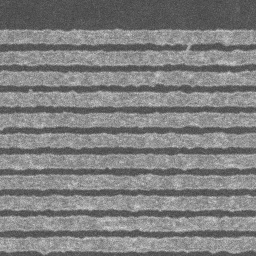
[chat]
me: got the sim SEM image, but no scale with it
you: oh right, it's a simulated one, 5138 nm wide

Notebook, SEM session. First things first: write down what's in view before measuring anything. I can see parallel lines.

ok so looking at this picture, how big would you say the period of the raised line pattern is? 416 nm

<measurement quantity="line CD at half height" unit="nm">263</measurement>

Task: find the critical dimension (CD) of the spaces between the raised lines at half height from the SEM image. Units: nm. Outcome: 158